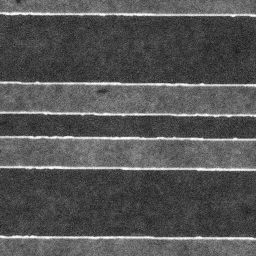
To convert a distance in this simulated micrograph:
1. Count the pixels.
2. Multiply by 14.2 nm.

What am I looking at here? lines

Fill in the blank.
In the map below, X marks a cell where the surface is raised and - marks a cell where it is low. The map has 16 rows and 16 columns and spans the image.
XXXXXXXXXXXXXXXX
----------------
----------------
----------------
----------------
XXXXXXXXXXXXXXXX
XXXXXXXXXXXXXXXX
----------------
----------------
XXXXXXXXXXXXXXXX
-XXXXXXXXXXXXXXX
----------------
----------------
----------------
----------------
XXXXXXXXXXXXXXXX